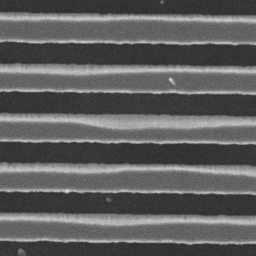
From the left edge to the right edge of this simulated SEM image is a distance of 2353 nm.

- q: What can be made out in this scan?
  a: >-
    lines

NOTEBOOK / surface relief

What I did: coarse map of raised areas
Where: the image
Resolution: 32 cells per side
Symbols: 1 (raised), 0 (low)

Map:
00000000000000000000000000000000
00000000000000000000000000000000
11111111111111111111111111111111
11111111111111111111111111111111
11111111111111111111111111111111
00000000000000000000001100000101
00000000000000000000000000000000
00000000000000000000000000000000
11111111110111111111111111100000
11111111111111111111111111111111
11111111111111111111111111111111
00000001011111111111111111111111
00000000000000000000000000000000
00000000000000000000000000000000
00000000000000000000000000000000
11111111111111111111111111111111
11111111111111111111111111111111
11111111111111111111111111111111
00000000000000000000000000000000
00000000000000000000000000000000
00000000000000000000000000000000
11111111111111111111111111111111
11111111111111111111111111111111
11111111111111111111111111111111
00000000000000000000000000000000
00000000000000000000000000000000
00000000000000000000000000000000
11111111111111111111111111111111
11111111111111111111111111111111
11111111111111111111111111111111
00000000000000000000000100011110
00000000000000000000000000000000